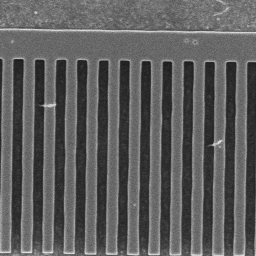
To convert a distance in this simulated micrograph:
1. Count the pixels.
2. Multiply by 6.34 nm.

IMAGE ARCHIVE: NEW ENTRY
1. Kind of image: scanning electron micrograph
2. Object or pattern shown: groups of lines, slits or small figures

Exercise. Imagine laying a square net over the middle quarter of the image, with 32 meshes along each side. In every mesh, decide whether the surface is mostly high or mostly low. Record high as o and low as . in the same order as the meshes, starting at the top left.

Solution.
.oo...ooo..ooo..ooo...ooo..ooo..
.oo...ooo..ooo..ooo...ooo..ooo..
.oo...oo...ooo..ooo...ooo..ooo..
.oo...oo...ooo..ooo...ooo..ooo..
.oo...oo...ooo..ooo...oo...ooo..
.oo...oo...ooo..ooo...oo...ooo..
.oo...oo...ooo..ooo...oo...ooo..
.oo...oo...ooo..ooo...oo...ooo..
.oo...oo...ooo..ooo...oo...ooo..
.oo...oo...ooo..ooo...oo...ooo..
.oo...oo...ooo..ooo...oo...ooo..
ooo...oo...ooo..ooo...oo...ooo..
ooo...oo...ooo..ooo...oo...ooo..
ooo...oo...ooo..ooo...oo...ooo..
ooo...oo...ooo..ooo...oo...ooo..
ooo...oo...ooo..ooo...oo...ooo..
ooo...oo...ooo..ooo...oo...ooo..
ooo...oo...ooo..ooo...oo...ooo..
ooo...oo...ooo..ooo...oo...ooo..
ooo...oo...ooo..ooo...oo...ooo..
ooo...oo...ooo..ooo...oo...ooo..
ooo...oo...ooo..ooo...oo...oo...
.oo...oo...ooo..ooo...oo...oo...
.oo...oo...ooo..ooo...oo...oo...
ooo...oo...ooo..ooo...oo...ooo..
ooo...oo...ooo..ooo...oo...ooo..
ooo..ooo...oo...ooo...oo...ooo..
ooo..ooo...oo...ooo..ooo...oo...
ooo..ooo...ooo..ooo..ooo...oo...
ooo..ooo...ooo..ooo..ooo...oo...
ooo..ooo...ooo..ooo..ooo...oo...
ooo..ooo...ooo..ooo..ooo...oo...